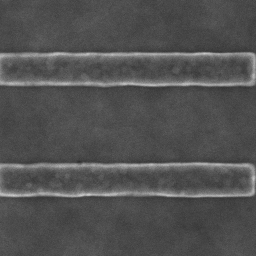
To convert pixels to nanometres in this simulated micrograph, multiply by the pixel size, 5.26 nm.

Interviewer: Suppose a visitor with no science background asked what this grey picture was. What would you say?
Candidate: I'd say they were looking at wiring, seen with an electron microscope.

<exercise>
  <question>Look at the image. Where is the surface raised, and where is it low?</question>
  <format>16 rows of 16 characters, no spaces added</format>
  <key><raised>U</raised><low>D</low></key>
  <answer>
DDDDDDDDDDDDDDDD
DDDDDDDDDDDDDDDD
DDDDDDDDDDDDDDDD
UUUUUUUUUUUUUUUU
UUUUUUUUUUUUUUUU
DDDDDDDDDDDDDDDD
DDDDDDDDDDDDDDDD
DDDDDDDDDDDDDDDD
DDDDDDDDDDDDDDDD
DDDDDDDDDDDDDDDD
UUUUUUUUUUUUUUUU
UUUUUUUUUUUUUUUU
DDDDDDDDDDDDDDDD
DDDDDDDDDDDDDDDD
DDDDDDDDDDDDDDDD
DDDDDDDDDDDDDDDD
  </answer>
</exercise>